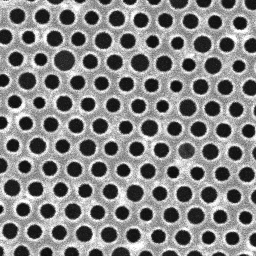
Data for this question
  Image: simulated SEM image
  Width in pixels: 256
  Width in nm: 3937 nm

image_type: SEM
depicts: a regular array of holes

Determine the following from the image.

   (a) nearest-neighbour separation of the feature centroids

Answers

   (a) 0.372 µm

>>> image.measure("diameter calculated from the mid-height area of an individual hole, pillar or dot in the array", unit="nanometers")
243